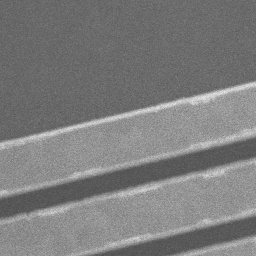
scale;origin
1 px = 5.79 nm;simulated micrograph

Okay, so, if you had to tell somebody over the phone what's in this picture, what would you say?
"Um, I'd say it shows one or a few lines or trenches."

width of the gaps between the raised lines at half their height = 142 nm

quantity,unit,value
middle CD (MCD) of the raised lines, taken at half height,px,49